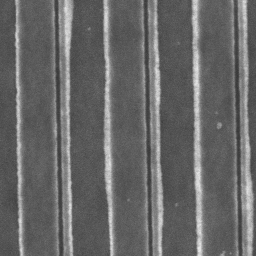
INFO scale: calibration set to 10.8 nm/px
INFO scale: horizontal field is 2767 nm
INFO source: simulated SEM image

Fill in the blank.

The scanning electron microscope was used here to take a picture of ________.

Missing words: lines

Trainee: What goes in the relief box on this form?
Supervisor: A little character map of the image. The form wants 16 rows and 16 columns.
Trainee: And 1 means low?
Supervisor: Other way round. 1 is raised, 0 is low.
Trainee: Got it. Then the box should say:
0111000111001110
0111000111001110
0111000111001110
0111000111001110
0111000111001110
0111000111001110
0111000111001110
0111000111001110
0111000111001110
0111000111001110
0111000111001110
0111000111001111
0111000111001111
0111000111001111
0111000111001111
0111000111000111